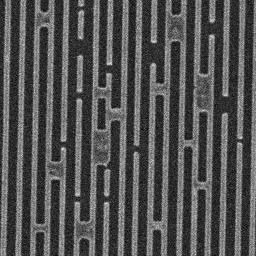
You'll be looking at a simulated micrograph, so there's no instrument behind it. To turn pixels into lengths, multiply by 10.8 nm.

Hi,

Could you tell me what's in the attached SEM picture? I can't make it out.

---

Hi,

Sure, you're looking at parallel lines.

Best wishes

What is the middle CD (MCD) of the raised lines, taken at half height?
52.6 nm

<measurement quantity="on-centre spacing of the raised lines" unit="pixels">14.6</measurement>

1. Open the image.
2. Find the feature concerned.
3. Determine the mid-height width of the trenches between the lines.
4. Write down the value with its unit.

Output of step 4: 108 nanometres